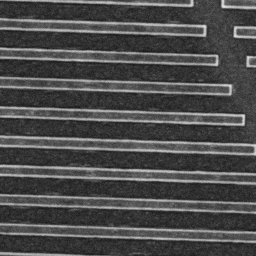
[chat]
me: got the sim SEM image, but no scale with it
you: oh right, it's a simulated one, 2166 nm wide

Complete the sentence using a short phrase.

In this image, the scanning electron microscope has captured parallel lines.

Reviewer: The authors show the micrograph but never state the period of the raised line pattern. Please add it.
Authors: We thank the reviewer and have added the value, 247 nm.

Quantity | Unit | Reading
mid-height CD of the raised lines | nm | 83.5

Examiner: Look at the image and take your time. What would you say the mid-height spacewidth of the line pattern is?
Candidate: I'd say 161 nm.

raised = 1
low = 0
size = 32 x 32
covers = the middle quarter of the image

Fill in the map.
00000000000000000000000000000000
00000000000000000000000000000000
00000000000000000000000000000000
00000000000000000000000000000000
11111111111111000000000000000000
11111111111111111111111111111111
00000011111111111111111111111111
00000000000000000000000000000000
00000000000000000000000000000000
00000000000000000000000000000000
00000000000000000000000000000000
10011000000000000000000000000000
11111111111111111111111111111101
11111111111111111111111111111111
00000000000000000000000111111111
00000000000000000000000000000000
00000000000000000000000000000000
00000000000000000000000000000000
00000000000000000000000000000000
11111111111111111111111100000000
11111111111111111111111111111111
00000000000000000111111111111111
00000000000000000000000000000000
00000000000000000000000000000000
00000000000000000000000000000000
00000000000000000000000000000000
11111111111111001100000000000000
11111111111111111111111111111111
00001111101111111111111111111111
00000000000000000000000000000000
00000000000000000000000000000000
00000000000000000000000000000000